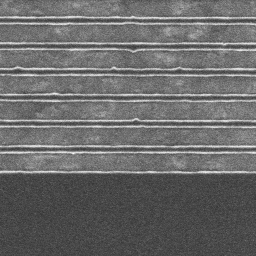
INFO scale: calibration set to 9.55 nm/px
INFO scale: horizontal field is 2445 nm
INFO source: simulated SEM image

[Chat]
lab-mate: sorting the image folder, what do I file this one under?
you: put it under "parallel lines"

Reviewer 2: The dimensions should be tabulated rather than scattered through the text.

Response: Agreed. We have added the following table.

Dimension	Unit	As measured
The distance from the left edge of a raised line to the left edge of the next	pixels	25.7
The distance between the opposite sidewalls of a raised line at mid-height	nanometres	65.7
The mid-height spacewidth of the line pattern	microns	0.178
